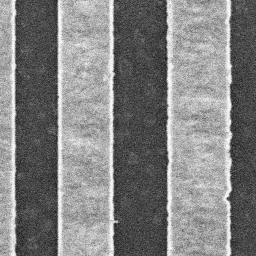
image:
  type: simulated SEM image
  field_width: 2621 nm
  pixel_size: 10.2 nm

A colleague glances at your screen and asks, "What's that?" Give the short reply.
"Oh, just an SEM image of one or a few lines or trenches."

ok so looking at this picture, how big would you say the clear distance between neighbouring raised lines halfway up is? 520 nm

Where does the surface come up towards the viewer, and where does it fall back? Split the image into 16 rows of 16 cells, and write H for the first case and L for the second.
HLLLHHHLLLHHHHLL
HLLLHHHLLLLHHHLL
HLLLHHHLLLHHHHLL
HLLLHHHLLLLHHHLL
HLLLHHHLLLLHHHLL
HLLLHHHLLLLHHHLL
HLLLHHHLLLLHHHLL
HLLLHHHLLLLHHHLL
HLLLHHHLLLLHHHLL
HLLLHHHLLLLHHHLL
HLLLHHHLLLLHHHLL
HLLLHHHLLLLHHHLL
HLLLHHHLLLLHHHLL
HLLLHHHLLLLHHHLL
HLLLHHHLLLLHHHLL
HLLLHHHLLLLHHHLL